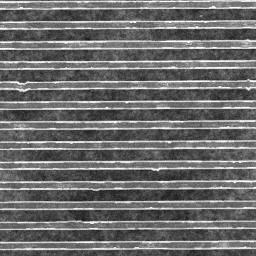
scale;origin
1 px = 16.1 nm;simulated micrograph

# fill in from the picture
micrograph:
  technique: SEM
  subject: parallel lines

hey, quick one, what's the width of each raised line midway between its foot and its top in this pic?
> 117 nanometers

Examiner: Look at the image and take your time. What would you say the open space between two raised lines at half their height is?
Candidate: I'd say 206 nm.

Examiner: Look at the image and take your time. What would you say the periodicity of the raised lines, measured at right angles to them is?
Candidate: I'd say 323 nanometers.